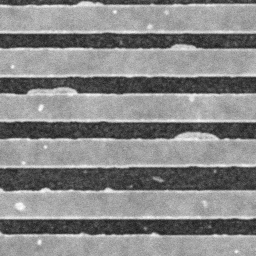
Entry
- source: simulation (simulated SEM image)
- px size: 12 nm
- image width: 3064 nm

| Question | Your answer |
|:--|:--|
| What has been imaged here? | lines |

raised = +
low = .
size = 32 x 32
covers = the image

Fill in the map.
................................
++++++++++++++++++++++++++++++++
++++++++++++++++++++++++++++++++
++++++++++++++++++++++++++++++++
................................
................................
++++++++++++++++++++++++++++++++
++++++++++++++++++++++++++++++++
++++++++++++++++++++++++++++++++
++++.++.........................
................................
................................
++++++++++++++++++++++++++++++++
++++++++++++++++++++++++++++++++
++++++++++++++++++++++++++++++++
................................
................................
++++++++++++++++++++++++++++++++
++++++++++++++++++++++++++++++++
++++++++++++++++++++++++++++++++
++++++++++++++++++++++++++++++++
................................
................................
................................
++++++++++++++++++++++++++++++++
++++++++++++++++++++++++++++++++
++++++++++++++++++++++++++++++++
................................
................................
++++++++++++++++++++++++++++++++
++++++++++++++++++++++++++++++++
++++++++++++++++++++++++++++++++